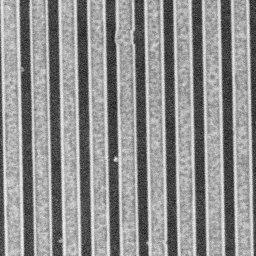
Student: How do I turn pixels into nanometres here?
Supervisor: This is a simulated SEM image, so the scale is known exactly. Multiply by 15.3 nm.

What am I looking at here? parallel lines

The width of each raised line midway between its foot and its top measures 230 nm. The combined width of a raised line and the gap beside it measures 0.441 micrometres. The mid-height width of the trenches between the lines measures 215 nm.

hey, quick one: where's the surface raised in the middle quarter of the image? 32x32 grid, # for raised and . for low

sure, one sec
###....###....###....###....####
###....###....###....###....####
###....###....###....###....####
###....###....###....###....####
###....###....###....####...####
###....###....###....####...####
###....###....###....####...####
###....###....###....####...####
###....###....###....####...####
###....###....###....####...####
###....###....###....####...####
###....###....###....####...####
###....###....###....####...####
###....###....###....####...####
###....###....###....####...####
###....###....###....####...####
###....###....###....####...####
###....###....###....####...####
###....###....###....####....###
###....###....####...####....###
###....###....####...####....###
###....####...####...####....###
###....####...####...####....###
###....####...####...####....###
###....####...####...####....###
###....####...####...####....###
###....####...####...####....###
###....####...####...####....###
###....####...####...####....###
###....####...####...####....###
###....####...####...####....###
###....####...####...####....###